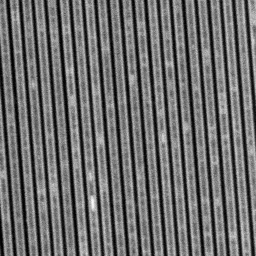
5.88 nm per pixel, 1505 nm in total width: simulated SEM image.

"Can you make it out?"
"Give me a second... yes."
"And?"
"parallel lines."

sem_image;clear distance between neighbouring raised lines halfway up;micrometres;0.0271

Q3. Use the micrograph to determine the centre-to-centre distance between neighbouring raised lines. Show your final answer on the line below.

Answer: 73.5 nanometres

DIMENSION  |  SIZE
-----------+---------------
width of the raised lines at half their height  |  49.1 nm